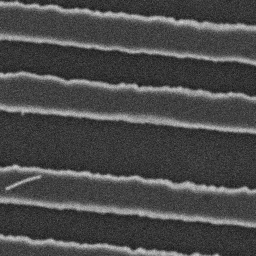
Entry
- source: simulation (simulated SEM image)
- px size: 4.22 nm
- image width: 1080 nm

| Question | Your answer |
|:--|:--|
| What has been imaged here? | lines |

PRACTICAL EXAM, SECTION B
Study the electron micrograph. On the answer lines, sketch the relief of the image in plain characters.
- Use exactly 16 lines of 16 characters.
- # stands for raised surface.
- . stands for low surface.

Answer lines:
####............
#############...
.###############
...........#####
................
###########.....
################
........########
................
................
##..............
###########.....
################
.........#######
................
########........